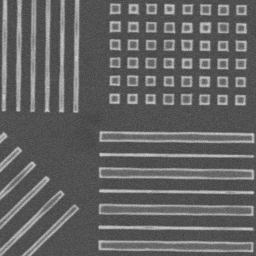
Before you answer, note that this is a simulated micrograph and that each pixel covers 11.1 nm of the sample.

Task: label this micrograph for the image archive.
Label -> groups of lines, slits or small figures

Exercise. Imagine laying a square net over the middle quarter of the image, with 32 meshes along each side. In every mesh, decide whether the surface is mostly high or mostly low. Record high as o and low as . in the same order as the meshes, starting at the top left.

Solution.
............oo..oo...oo..oo...oo
................................
................................
............oo..oo...oo..oo...oo
............oo..oo...oo..oo...oo
..............................oo
................................
................................
............oo..oo...oo..oo..ooo
............oo..oo...oo..oo..ooo
................................
................................
................................
................................
................................
................................
................................
.........ooooooooooooooooooooooo
.........ooooooooooooooooooooooo
................................
................................
................................
................................
................................
................................
................................
.........ooooooooooooooooooooooo
.........ooooooooooooooooooooooo
................................
................................
................................
................................